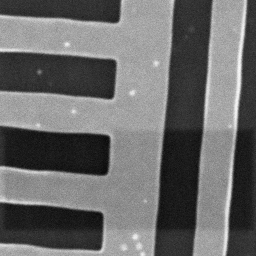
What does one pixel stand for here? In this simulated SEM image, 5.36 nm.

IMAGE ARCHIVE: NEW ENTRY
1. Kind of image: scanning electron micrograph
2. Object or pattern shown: groups of lines, slits or small figures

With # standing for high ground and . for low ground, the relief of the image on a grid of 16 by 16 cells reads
........###..##.
###########..##.
###########..##.
.....######..##.
.......###...##.
.......###...##.
##########...##.
##########...##.
.......###...##.
.......###...##.
.......###...#..
##########..##..
##########..##..
......####..##..
.......###..##..
###...####..##..